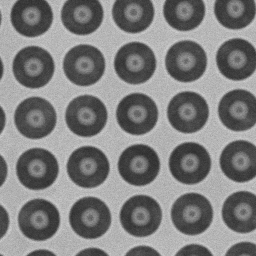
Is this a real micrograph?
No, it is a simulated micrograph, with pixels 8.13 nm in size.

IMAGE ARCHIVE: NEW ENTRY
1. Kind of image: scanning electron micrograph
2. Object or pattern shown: an array of small figures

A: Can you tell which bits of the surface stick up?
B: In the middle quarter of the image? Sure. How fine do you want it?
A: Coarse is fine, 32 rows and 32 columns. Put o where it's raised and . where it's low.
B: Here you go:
....ooo....o.....oo....oo.....o.
....oo....oo...........ooo......
..........ooo.........oooo......
o........ooooo........ooooo.....
oo......ooooooo......oooooooo...
oooo...ooooooooooooooooooooooooo
oooooooooooooooooooooooooooooo.o
ooooo.oooooooooo....oooooooo....
oo.......oooooo.......ooooo.....
o.........oooo.........ooo......
o..........oo..........ooo......
...........oo....ooo....oo...ooo
....ooo....oo....ooo....oo....oo
....ooo....oo....ooo....oo......
...........oo..........ooo......
o.........oooo.........oooo.....
o.........oooo........oooooo....
ooo......ooooooo....oooooooooo.o
oooooooooooooooooooooooooooooooo
oooooooooooooooooooooooooooooo..
ooooo..ooooooooo.....ooooooo....
ooo......oooooo.......ooooo.....
oo........oooo.........oooo.....
o..........ooo..........oo.....o
o....oo....oo.....oo....oo....oo
.....oo.....o....ooo....oo....oo
o....oo.....o.....o.....oo......
o..........ooo..........ooo.....
o..........ooo.........ooooo....
oo........ooooo.......ooooooo...
ooo......ooooooooo..oooooooooooo
oooooooooooooooooooooooooooooooo